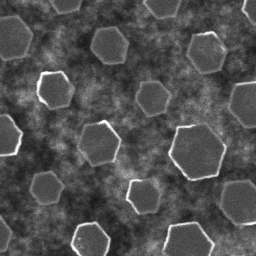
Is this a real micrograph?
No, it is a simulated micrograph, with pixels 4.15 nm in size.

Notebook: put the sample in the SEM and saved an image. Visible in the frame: raised bodies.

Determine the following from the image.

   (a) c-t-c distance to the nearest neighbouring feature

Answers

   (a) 286 nm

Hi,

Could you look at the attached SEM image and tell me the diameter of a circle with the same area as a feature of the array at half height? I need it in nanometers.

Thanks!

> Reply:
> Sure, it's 149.